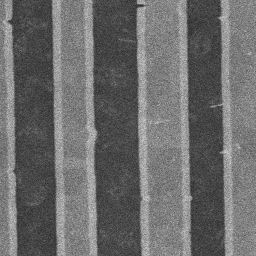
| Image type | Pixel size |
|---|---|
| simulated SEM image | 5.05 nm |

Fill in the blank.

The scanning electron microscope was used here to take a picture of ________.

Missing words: one or a few lines or trenches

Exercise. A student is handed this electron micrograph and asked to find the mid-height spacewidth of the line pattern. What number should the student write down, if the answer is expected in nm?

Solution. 240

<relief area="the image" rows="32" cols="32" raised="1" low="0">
10000001111000000011111000001111
10000001111000000011111000001111
10000001111000000011111000001111
10000001111000000011111000001111
10000001111000000011111000001111
10000001111000000011111000001111
10000001111000000011111000001111
10000001111000000011111000001111
10000001111000000011111000001111
10000001111000000011111000001111
10000001111000000011111000001111
10000001111000000011111000001111
10000001111000000011111000001111
10000001111000000011111000001111
10000001111000000011111000001111
10000001111000000011111000001111
10000001111100000011111000001111
10000001111000000011111000001111
10000001111000000011111000001111
10000001111000000011111000001111
10000001111000000011111000001111
10000001111000000011111000000111
10000001111000000011111000000111
10000000111000000011111000000111
11000000111100000011111000000111
11000000111100000011111000000111
11000000111100000011111000000111
11000000111100000011111000000111
11000000111100000011111000000111
11000000111100000011111000000111
11000000111100000011111000000111
11000000111100000011111000000111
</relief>